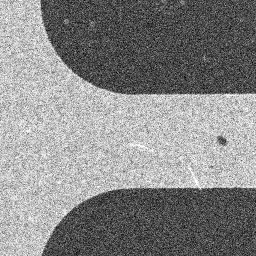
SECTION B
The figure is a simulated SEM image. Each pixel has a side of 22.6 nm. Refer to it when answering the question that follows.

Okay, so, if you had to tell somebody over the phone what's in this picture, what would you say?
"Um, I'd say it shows one or a few lines or trenches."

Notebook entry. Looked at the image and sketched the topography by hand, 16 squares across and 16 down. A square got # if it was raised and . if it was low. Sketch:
###.............
###.............
###.............
####............
#####...........
######..........
################
################
################
################
################
################
#####...........
####............
###.............
###.............